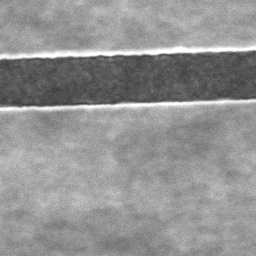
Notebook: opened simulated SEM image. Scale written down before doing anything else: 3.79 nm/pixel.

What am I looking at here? one or a few lines or trenches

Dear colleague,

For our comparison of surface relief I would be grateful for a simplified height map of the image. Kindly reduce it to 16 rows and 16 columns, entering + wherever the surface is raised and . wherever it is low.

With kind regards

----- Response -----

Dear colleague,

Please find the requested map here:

++++++++++++++++
++++++++++++++++
++++++++++++++++
++++............
................
................
.........+++++++
++++++++++++++++
++++++++++++++++
++++++++++++++++
++++++++++++++++
++++++++++++++++
++++++++++++++++
++++++++++++++++
++++++++++++++++
++++++++++++++++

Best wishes